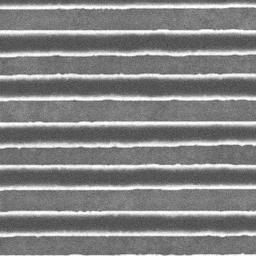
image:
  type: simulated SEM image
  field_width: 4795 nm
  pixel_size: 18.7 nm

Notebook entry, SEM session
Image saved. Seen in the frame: lines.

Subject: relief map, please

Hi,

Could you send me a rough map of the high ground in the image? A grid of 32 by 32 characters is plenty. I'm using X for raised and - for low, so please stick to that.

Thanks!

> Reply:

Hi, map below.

XXXXXXXXXXXXXXXXXXXXXXXXXXXXXXXX
--------------------------------
--------------------------------
--------------------------------
XXXXXXXXXXXXXXXXXXXXXXXXXXXXXXXX
XXXXXXXXXXXXXXXXXXXXXXXXXXXXXXXX
XXXXXXXXXXXXXXXXXXXXXXXXXXXXXXXX
--------------------------------
--------------------------------
------XXXXX-XXXXXXXXXXXXXXXXXXXX
XXXXXXXXXXXXXXXXXXXXXXXXXXXXXXXX
XXXXXXXXXXXXXXXXXXXXXXXXXXXXXXXX
--------------------------------
--------------------------------
--------------------------------
-XXXXXXXXXXXXXXXXXXXXXXXXXXXXXXX
XXXXXXXXXXXXXXXXXXXXXXXXXXXXXXXX
XXXXXXXXXXXXXXXXXXXXXXXXXXXXXXXX
--------------------------------
--------------------------------
--------------------------------
XXXXXXXXXXXXXXXXXXXXXXXXXXXXXXXX
XXXXXXXXXXXXXXXXXXXXXXXXXXXXXXXX
XXXXXXXXXXXXXXXXXXXXXXX-XXX-----
--------------------------------
--------------------------------
--------------XXX--X--------XX--
XXXXXXXXXXXXXXXXXXXXXXXXXXXXXXXX
XXXXXXXXXXXXXXXXXXXXXXXXXXXXXXXX
--------------------------------
--------------------------------
--------------------------------